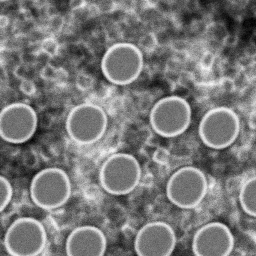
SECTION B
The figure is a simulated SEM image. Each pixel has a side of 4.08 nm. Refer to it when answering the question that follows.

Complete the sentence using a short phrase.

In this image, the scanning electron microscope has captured raised bodies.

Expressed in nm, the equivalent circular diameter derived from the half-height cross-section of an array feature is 158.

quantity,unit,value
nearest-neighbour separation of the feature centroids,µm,0.248